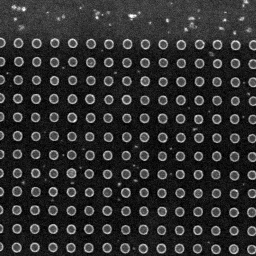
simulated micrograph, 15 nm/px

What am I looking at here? a regular array of raised bodies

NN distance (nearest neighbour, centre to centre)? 17.9 px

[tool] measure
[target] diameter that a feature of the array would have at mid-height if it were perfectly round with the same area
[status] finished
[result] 137 nanometres